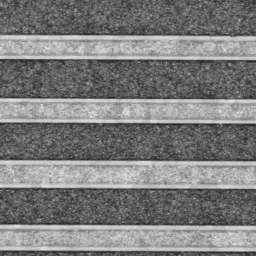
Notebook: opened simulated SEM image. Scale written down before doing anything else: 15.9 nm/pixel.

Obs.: one or a few lines or trenches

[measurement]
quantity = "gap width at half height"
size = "667 nanometres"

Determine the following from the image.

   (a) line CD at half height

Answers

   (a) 334 nm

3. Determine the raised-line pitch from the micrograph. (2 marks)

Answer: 1010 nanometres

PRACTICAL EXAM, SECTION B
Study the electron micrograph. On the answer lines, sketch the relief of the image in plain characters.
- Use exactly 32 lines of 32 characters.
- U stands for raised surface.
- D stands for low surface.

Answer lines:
DDDDDDDDDDDDDDDDDDDDDDDDDDDDDDDD
DDDDDDDDDDDDDDDDDDDDDDDDDDDDDDDD
DDDDDDDDDDDDDDDDDDDDDDDDDDDDDDDD
DDDDDDDDDDDDDDDDDDDDDDDDDDDDDDDD
DDDDDDDDDDDDDDDDDDDDDDDDDDDDDDDD
UUUUUUUUUUUUUUUUUUUUUUUUUUUUUUUU
UUUUUUUUUUUUUUUUUUUUUUUUUUUUUUUU
DDDDDDDDDDDDDDDDDDDDDDDDDDDDDDDD
DDDDDDDDDDDDDDDDDDDDDDDDDDDDDDDD
DDDDDDDDDDDDDDDDDDDDDDDDDDDDDDDD
DDDDDDDDDDDDDDDDDDDDDDDDDDDDDDDD
DDDDDDDDDDDDDDDDDDDDDDDDDDDDDDDD
DDDDDDDDDDDDDDDDDDDDDDDDDDDDDDDD
UUUUUUUUUUUUUUUUUUUUUUUUUUUUUUUU
UUUUUUUUUUUUUUUUUUUUUUUUUUUUUUUU
DDDDDDDDDDDDDDDDDDDDDDDDDDDDDDDD
DDDDDDDDDDDDDDDDDDDDDDDDDDDDDDDD
DDDDDDDDDDDDDDDDDDDDDDDDDDDDDDDD
DDDDDDDDDDDDDDDDDDDDDDDDDDDDDDDD
DDDDDDDDDDDDDDDDDDDDDDDDDDDDDDDD
UUUUUUUUUUUUUUUUUUUUUUUDDDDDDDDD
UUUUUUUUUUUUUUUUUUUUUUUUUUUUUUUU
UUUUUUUUUUUUUUUUUUUUUUUUUUUUUUUU
DDDDDDDDDDDDDDDDDDDDDDDDDDDDDDDD
DDDDDDDDDDDDDDDDDDDDDDDDDDDDDDDD
DDDDDDDDDDDDDDDDDDDDDDDDDDDDDDDD
DDDDDDDDDDDDDDDDDDDDDDDDDDDDDDDD
DDDDDDDDDDDDDDDDDDDDDDDDDDDDDDDD
UUUUUUUUUUDDDDDDDUDDDDDDDDDDDDDD
UUUUUUUUUUUUUUUUUUUUUUUUUUUUUUUU
UUUUUUUUUUUUUUUUUUUUUUUUUUUUUUUU
DDDDDDDDDDDDDDDDDDDDDDDDDDDDDDDD